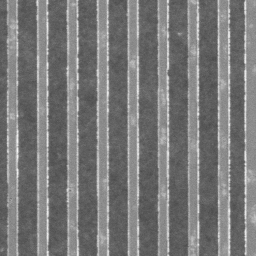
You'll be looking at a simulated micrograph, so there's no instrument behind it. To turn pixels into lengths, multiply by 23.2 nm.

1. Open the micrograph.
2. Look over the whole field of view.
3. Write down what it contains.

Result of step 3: parallel lines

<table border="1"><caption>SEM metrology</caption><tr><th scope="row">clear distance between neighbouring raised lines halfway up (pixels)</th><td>8.87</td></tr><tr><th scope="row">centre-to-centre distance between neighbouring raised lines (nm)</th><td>697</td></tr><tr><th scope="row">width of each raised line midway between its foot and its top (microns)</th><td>0.494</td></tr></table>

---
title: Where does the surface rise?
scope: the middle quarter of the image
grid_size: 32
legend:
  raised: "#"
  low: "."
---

#..######..#####..######..#####.
#..######..#####..######..#####.
#..######..#####..######..#####.
#..######..#####...#####..#####.
#..######..#####...#####..#####.
#..######..#####...#####..#####.
#..######..#####...#####..#####.
#..######..#####...#####..#####.
#..######..#####...#####..#####.
#..######..#####...#####..#####.
#..######..#####...#####..#####.
#..######..#####...#####..#####.
#..######..#####...#####..#####.
#..######..#####...#####..#####.
#..######..#####...#####..#####.
#..######..#####...#####..#####.
#..######..#####...#####..#####.
#..######..#####...#####..#####.
#..######..#####...#####..#####.
#..######..#####...#####..#####.
#..######..#####...#####..#####.
#..#####...#####...#####..#####.
#..######..#####...#####..#####.
#..######..#####...#####..#####.
#..######..#####...#####..#####.
#..######..#####...#####..#####.
#..######..#####...#####..#####.
#..######..#####...#####..#####.
#..######..#####...#####..#####.
#..######..#####...#####..#####.
#..######..#####...#####..#####.
#..######..#####...#####..#####.